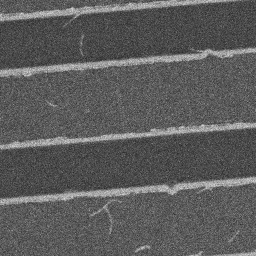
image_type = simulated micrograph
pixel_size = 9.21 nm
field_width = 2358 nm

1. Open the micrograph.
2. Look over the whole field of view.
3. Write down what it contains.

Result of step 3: one or a few lines or trenches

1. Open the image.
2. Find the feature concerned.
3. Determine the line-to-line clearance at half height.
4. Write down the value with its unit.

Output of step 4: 487 nanometres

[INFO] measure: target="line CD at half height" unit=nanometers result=693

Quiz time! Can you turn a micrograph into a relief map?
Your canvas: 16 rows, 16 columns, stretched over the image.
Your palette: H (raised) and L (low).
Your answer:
HHHHHHHHLLLLLLLL
LLLLLLLLLLLLLLLL
LLLLLLLLLLLLLLLL
LLLLLLLLLLLLHHHH
HHHHHHHHHHHHHHHH
HHHHHHHHHHHHHHHH
HHHHHHHHHHHHHHHH
HHHHHHHHHHHHHHHH
HHHHHHHHLLLLLLLL
LLLLLLLLLLLLLLLL
LLLLLLLLLLLLLLLL
LLLLLLLLLLLLHHHH
LHHHHHHHHHHHHHHH
HHHHHHHHHHHHHHHH
HHHHHHHHHHHHHHHH
HHHHHHHHHHHHHHHH